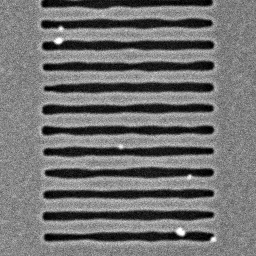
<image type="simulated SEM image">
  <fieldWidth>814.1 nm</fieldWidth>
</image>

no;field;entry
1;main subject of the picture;groups of lines, slits or small figures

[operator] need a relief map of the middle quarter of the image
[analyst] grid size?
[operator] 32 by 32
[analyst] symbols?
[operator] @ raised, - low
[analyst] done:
--------------------------------
--------------------------------
@@@@@@@@@@@@@@@@@@@@@@@@@@@@@@@@
@@@@@@@@@@@@@@@@@@@@@@@@@@@@@@@@
@@@@@@@@@@@@@@@@@@@@@--@@@@@@@@@
--------------------------------
--------------------------------
@@@@@@@@@@@@@@@@@@@@@@@@@@@@@@@@
@@@@@@@@@@@@@@@@@@@@@@@@@@@@@@@@
@@@@@@@@@@@@@@@@@@@@@@@@@@@@@@@@
--------------------------------
--------------------------------
@@@@@@@@@@@@@@@@@@@@@@@@@@@@@@@@
@@@@@@@@@@@@@@@@@@@@@@@@@@@@@@@@
@@@@@@@@@@@@@@@@@@@@@@@@@@@@@@@@
@@@@@@@--------@@@@-----@@@--@@@
--------------------------------
--------------------------------
@@@@@@@@@@@@@@@@@@@@@@@@@@@@@@@@
@@@@@@@@@@@@@@@@@@@@@@@@@@@@@@@@
@@@@@@@@@@@@@@@@@@@@@@@@@@@@@@@@
--------------------------------
--------------------------------
@--@@@@@@@@@@@@@@@@@@@@@@@@@@@@@
@@@@@@@@@@@@@@@@@@@@@@@@@@@@@@@@
@@@@@@@@@@@@@@@@@@@@@@@@@@@@@@@@
--------------------------------
--------------------------------
-------@@@@@@@@@----------@@@@@@
@@@@@@@@@@@@@@@@@@@@@@@@@@@@@@@@
@@@@@@@@@@@@@@@@@@@@@@@@@@@@@@@@
--------@@@@--------------------